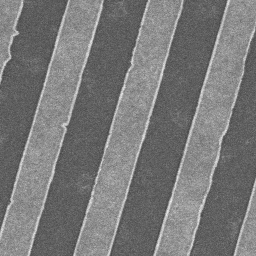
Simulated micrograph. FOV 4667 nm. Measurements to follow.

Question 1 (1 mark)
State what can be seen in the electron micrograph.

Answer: one or a few lines or trenches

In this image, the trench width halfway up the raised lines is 0.798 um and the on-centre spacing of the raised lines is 1400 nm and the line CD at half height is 586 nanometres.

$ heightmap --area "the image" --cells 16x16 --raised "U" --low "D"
UDDDUUDDDUUDDDUU
UDDDUUDDDUUDDDUU
UDDDUUDDDUUDDDUU
UDDUUDDDUUDDDUUD
DDDUUDDDUUDDDUUD
DDDUUDDDUUDDDUUD
DDUUUDDUUUDDUUUD
DDUUDDDUUDDDUUDD
DDUUDDDUUDDDUUDD
DDUUDDDUUDDDUUDD
DUUDDDUUDDDUUDDD
DUUDDDUUDDDUUDDD
DUUDDDUUDDDUUDDD
UUDDDUUDDDUUDDDU
UUDDDUUDDDUUDDDU
UUDDDUUDDDUUDDDU